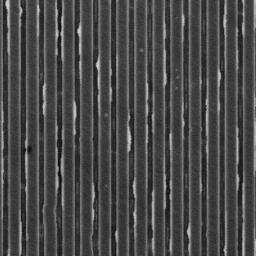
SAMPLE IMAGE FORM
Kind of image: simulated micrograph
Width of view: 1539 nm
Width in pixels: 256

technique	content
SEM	parallel lines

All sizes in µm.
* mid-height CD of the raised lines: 0.0797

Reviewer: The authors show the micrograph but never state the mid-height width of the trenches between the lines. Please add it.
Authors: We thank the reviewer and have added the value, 31.6 nm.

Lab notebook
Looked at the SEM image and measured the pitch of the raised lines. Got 108 nanometers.